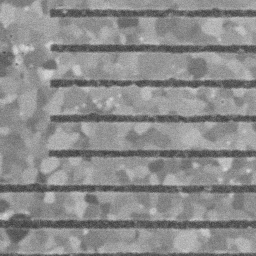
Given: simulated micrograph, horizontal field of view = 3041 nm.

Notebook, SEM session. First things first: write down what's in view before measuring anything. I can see parallel lines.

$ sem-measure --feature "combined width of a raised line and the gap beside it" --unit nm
415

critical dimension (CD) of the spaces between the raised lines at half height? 98 nm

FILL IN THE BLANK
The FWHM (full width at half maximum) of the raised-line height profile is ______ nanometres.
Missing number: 316